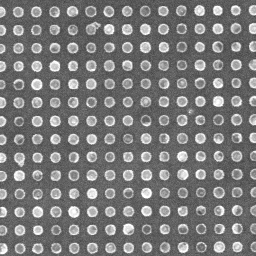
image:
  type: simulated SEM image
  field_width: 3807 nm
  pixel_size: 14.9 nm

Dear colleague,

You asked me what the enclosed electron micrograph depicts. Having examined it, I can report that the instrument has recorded a regular array of raised bodies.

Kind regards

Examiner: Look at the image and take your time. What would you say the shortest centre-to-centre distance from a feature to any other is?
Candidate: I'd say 265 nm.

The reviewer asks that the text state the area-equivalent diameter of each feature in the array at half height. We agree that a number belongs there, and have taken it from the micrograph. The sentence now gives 143 nm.